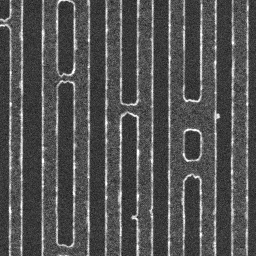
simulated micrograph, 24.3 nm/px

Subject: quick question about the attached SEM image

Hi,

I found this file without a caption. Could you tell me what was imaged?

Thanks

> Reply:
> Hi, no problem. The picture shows parallel lines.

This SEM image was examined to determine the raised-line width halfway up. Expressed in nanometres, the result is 364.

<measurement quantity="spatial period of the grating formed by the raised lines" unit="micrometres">0.777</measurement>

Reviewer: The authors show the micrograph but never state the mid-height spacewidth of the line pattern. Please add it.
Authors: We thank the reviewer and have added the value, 16.5 px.